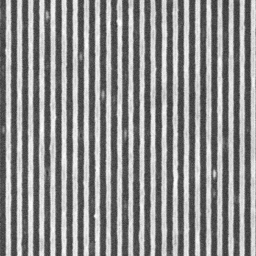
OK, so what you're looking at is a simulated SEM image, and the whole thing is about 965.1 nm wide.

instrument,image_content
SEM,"parallel lines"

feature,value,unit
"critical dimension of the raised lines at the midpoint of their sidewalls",12.7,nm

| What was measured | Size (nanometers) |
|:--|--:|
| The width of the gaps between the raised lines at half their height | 29.2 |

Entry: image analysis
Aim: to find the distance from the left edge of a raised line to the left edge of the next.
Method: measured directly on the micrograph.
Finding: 42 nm